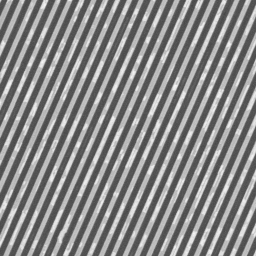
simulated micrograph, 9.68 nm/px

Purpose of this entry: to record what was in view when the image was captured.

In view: parallel lines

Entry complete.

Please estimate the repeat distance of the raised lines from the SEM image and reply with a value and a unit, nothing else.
106 nm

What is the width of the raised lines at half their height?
47.7 nanometers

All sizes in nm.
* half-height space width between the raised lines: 65.4